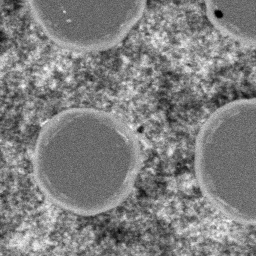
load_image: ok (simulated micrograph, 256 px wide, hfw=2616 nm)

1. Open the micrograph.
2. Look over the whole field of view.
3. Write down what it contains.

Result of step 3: raised bodies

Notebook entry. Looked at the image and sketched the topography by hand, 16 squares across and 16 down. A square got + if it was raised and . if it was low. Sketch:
..+++++++....+++
...+++++......++
...++++........+
................
................
................
...............+
...++++......+++
...+++++.....+++
..+++++++...++++
..++++++....++++
..++++++.....+++
...++++......+++
..............++
................
................